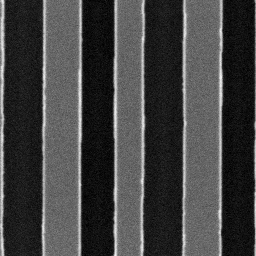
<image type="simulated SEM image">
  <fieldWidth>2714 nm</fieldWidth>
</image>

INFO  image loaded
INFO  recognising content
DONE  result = lines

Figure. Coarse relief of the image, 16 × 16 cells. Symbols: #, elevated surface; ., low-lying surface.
...##..##...##..
...##..##...##..
...##..##...##..
...##..##...##..
...##..##...##..
...##..##..###..
...##..##...##..
...##..##...##..
...##..##...##..
...##..##...##..
...##..##...##..
...##..##..###..
...##..##..###..
...##..##..###..
...##..##..###..
...##..##..###..